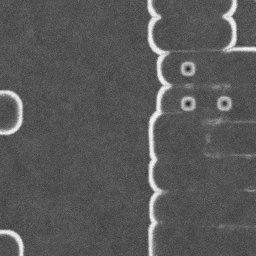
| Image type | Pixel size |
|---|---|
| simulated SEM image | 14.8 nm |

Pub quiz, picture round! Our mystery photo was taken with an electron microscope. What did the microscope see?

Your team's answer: wiring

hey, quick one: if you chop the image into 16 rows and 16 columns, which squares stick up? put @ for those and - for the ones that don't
---------@@@@@@-
---------@@@@@@-
---------@@@@@@-
----------@@@@@@
----------@@@@@@
----------@@@@@@
@---------@@@@@@
@---------@@@@@@
---------@@@@@@@
----------@@@@@@
---------@@@@@@@
----------@@@@@@
----------@@@@@@
----------@@@@@@
---------@@@@@@@
@--------@@@@@@@